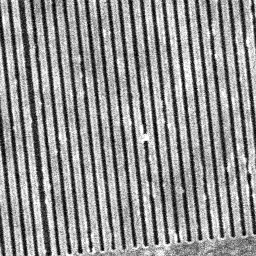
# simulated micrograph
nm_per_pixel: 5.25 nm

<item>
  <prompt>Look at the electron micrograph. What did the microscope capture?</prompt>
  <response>parallel lines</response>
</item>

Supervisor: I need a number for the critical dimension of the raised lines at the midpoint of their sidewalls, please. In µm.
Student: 0.0352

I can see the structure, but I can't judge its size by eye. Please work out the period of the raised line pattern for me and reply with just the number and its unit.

57.6 nm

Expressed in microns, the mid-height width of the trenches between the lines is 0.0255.